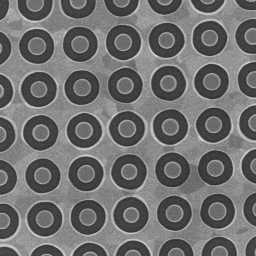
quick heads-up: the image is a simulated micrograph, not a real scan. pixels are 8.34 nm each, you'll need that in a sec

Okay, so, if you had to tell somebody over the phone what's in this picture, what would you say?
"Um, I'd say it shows an array of small figures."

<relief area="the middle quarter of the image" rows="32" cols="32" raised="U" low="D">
UUUUUUUUUUUUUUUUUUUUUUUUDDDDUUUU
UUUUUUUUUUUUUDDDDDUUUUUDDDDDDUUU
UUDDDDDUUUUUDDDDDDDUUUDDDDDDDDUU
UDDDDDDDUUUDDDDDDDDUUUDDDUUDDDUU
DDDUUUDDDUUDDDUUUDDDUUDDUUUUDDDU
DDDUUUUDDUUDDUUUUDDDUUDDUUUUDDDU
DDDUUUDDDUUDDDUUUDDDUUDDDDDDDDUU
DDDUUUDDDUUDDDDDDDDUUUDDDDDDDDUU
UDDDDDDDUUUUDDDDDDDUUUUDDDDDDUUU
UUDDDDDUUUUUUUDDDUUUUUUUUUUUUUUU
UUUUUUUUUUUUUUUUUUUUUUUUUUUUUUUU
UUUUUUUUUUUUUUUUUUUUUUUUUDDDUUUU
UUUUDDDUUUUUUDDDDDUUUUUDDDDDDDUU
UUDDDDDDUUUUDDDDDDDDUUUDDDDDDDUU
UDDDDDDDDUUDDDDUUDDDUUDDDUUUDDDU
UDDUUUDDDDUDDDUUUUDDUUDDDUUUDDDU
DDDUUUUDDDUDDDUUUUDDDUDDDUUUDDDU
UDDUUUUDDDUDDDUUUDDDUUDDDDDDDDDU
UDDDUUDDDUUUDDDDDDDDUUUDDDDDDDUU
UDDDDDDDDUUUUDDDDDDUUUUUDDDDDUUU
UUUDDDDDUUUUUUUDDUUUUUUUUUUUUUUU
UUUUUUUUUUUUUUUUUUUUUUUUUUUUUUUU
UUUUUUUUUUUUUUUUDUUUUUUUUDDDDUUU
UUUDDDDDUUUUUDDDDDDUUUUUDDDDDDUU
UUDDDDDDDUUUUDDDDDDDUUUDDDDDDDDU
UDDDDDDDDDUUDDDUUDDDDUUDDDUUUDDU
UDDDUUUDDDUUDDDUUUDDDUUDDUUUUDDD
UDDDUUUUDDUUDDDUUUDDDUUDDDUUUDDU
UDDDUUUDDDUUDDDUUDDDDUUDDDDDDDDU
UUDDDDDDDUUUDDDDDDDDUUUUDDDDDDUU
UUDDDDDDDUUUUDDDDDDUUUUUUDDDDUUU
UUUUDDDUUUUUUUUUDDUUUUUUUUUUUUUU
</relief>